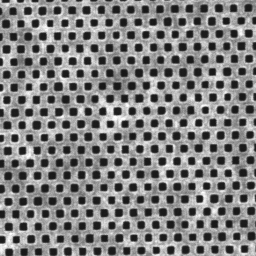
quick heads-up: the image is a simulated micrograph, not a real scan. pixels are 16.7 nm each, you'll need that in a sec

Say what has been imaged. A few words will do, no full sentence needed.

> a regular array of holes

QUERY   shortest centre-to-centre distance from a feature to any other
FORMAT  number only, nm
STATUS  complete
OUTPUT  238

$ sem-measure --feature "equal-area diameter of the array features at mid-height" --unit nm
148